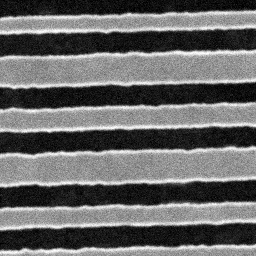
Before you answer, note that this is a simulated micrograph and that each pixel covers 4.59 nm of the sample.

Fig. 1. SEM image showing lines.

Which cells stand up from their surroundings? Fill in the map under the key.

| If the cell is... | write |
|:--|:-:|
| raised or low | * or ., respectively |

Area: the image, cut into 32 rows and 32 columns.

................................
..............................**
********************************
*******************************.
................................
................................
.....................***********
********************************
********************************
********************************
*****************.*.............
................................
................................
.........***********************
********************************
********************************
................................
................................
............................*..*
********************************
********************************
********************************
*******************************.
................................
................................
.....................***.*******
********************************
********************************
***.............................
................................
................................
********************************